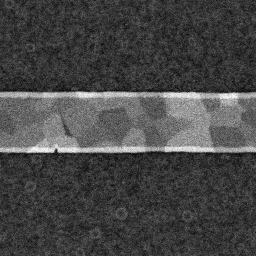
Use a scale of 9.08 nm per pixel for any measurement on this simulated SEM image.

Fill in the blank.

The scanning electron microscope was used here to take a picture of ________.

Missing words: one or a few lines or trenches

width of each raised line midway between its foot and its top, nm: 497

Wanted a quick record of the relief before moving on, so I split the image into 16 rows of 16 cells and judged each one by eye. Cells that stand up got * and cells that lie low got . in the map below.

................
................
................
................
................
................
****************
****************
****************
................
................
................
................
................
................
................